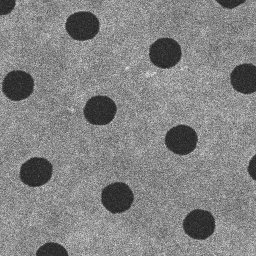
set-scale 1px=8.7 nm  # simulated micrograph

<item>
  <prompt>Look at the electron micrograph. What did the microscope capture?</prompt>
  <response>a regular array of holes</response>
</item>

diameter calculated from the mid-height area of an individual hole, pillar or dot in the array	277	nm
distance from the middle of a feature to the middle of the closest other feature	748	nm